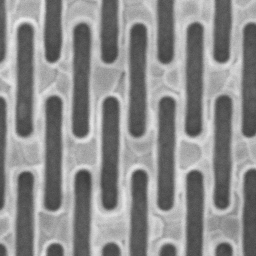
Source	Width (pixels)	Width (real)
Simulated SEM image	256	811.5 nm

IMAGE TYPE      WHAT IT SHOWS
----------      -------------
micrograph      a regular array of holes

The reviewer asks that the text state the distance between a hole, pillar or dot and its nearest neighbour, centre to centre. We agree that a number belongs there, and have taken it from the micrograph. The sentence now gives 179 nanometres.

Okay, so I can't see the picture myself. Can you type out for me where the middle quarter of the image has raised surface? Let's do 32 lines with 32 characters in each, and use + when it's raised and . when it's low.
++.....+++++++++.....+++++++++..
++.....+++++++++.....+++++++++..
++.....+++++++++.....+++++++++..
++....++++++++++.....+++++++++..
++....++++++++++.....+++++++++..
++....++++++++++.....+++++++++..
++....++++++++++.....+++++++++..
++....++++++++++.....+++++++++..
++....++++...+++.....+++...+++..
++....+++.....++.....+++....++..
++.....++.....++.....++.....++..
++....+++.....++.....++.....++..
++....+++.....++.....++.....++..
++....+++.....++.....++.....++..
++....+++.....++.....++.....++..
++....+++.....++.....++.....++..
++....+++.....++.....++.....++..
++....+++.....++....+++.....+++.
+++..++++.....++++.++++.....++++
+++++++++.....+++++++++.....++++
+++++++++.....+++++++++.....++++
+++++++++.....+++++++++.....++++
+++++++++.....+++++++++.....++++
+++++++++.....+++++++++.....++++
+++++++++.....+++++++++.....++++
+++++++++.....+++++++++.....++++
++++..+++.....++++..+++.....++++
+++....++.....+++....++.....+++.
+++....++.....+++....++.....+++.
++.....++.....++.....++.....+++.
++.....++.....++.....++.....++..
++.....++.....++.....++.....++..